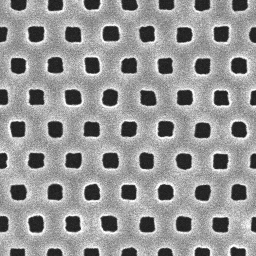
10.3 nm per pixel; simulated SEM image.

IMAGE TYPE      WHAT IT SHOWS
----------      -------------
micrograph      a regular array of holes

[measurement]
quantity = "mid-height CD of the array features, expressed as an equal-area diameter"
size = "0.179 microns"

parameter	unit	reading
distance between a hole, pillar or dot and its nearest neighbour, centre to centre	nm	371